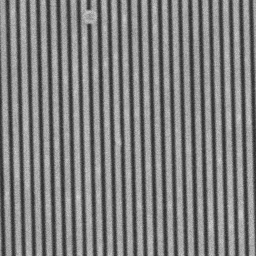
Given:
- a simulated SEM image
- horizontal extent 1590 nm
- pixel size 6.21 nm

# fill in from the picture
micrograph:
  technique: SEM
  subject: parallel lines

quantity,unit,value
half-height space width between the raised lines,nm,31.8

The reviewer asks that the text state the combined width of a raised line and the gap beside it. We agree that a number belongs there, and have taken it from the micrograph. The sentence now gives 63 nm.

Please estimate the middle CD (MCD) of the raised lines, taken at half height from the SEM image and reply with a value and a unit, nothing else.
0.0318 um